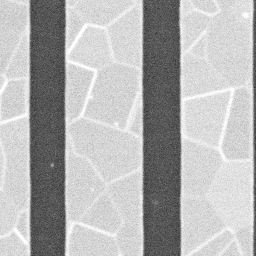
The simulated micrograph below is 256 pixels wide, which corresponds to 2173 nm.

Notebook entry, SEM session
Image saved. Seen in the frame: wiring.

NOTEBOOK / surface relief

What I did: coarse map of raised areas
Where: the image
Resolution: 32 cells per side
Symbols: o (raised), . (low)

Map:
oooo....oooooooooo.....ooooooooo
oooo....oooooooooo.....ooooooooo
oooo....oooooooooo.....oooooooo.
oooo....oooooooooo.....oooooooo.
oooo....oooooooooo.....oooooooo.
oooo....oooooooooo.....oooooooo.
oooo....oooooooooo.....oooooooo.
oooo....oooooooooo.....oooooooo.
oooo....oooooooooo.....oooooooo.
oooo....oooooooooo.....oooooooo.
oooo....oooooooooo.....oooooooo.
oooo....oooooooooo.....ooooooooo
oooo....oooooooooo.....ooooooooo
oooo....oooooooooo.....ooooooooo
oooo....oooooooooo.....ooooooooo
oooo....oooooooooo.....ooooooooo
oooo....oooooooooo.....ooooooooo
oooo....oooooooooo.....ooooooooo
oooo....oooooooooo.....ooooooooo
oooo....oooooooooo.....ooooooooo
oooo....oooooooooo.....ooooooooo
oooo....oooooooooo.....ooooooooo
oooo....oooooooooo.....ooooooooo
oooo....oooooooooo.....ooooooooo
oooo....oooooooooo.....ooooooooo
oooo....oooooooooo.....ooooooooo
oooo....oooooooooo.....ooooooooo
oooo....oooooooooo.....ooooooooo
oooo....oooooooooo.....ooooooooo
oooo....oooooooooo.....ooooooooo
oooo....oooooooooo.....ooooooooo
oooo....oooooooooo.....ooooooooo